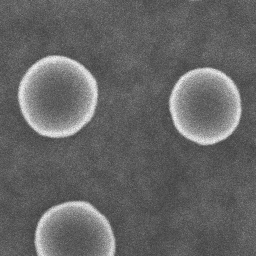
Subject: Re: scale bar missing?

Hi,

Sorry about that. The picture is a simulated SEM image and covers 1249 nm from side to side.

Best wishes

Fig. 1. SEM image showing raised bodies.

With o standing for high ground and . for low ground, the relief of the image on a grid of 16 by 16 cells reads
................
................
................
................
..ooo.......oo..
.ooooo.....oooo.
.ooooo.....oooo.
..ooo......oooo.
............oo..
................
................
................
................
...ooo..........
..ooooo.........
..ooooo.........